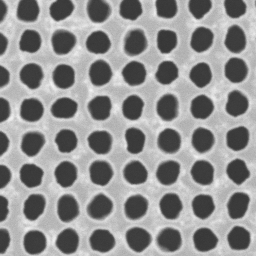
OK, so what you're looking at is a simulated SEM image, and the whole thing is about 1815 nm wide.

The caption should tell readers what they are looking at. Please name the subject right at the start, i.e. a regular array of holes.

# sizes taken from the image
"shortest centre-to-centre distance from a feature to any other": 229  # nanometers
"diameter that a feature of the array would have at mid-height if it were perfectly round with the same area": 0.171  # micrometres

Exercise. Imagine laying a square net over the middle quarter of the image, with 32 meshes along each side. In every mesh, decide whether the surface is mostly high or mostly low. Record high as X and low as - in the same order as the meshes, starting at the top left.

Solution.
--XXXXX-----XXX-----XXXX----XXXX
---XXX------XXX------XX------XXX
---XXX------XX-------XX------XX-
---XXXX-----XXX-----XXX-----XXXX
---XXXX----XXXX-----XXXX---XXXXX
--XXXXXXXXXXXXXXXXXXXXXXXXXXXXXX
XXXXXXXXXXXXXXXXXXXXXXXXXXXXXXXX
XXXXXXXXXXXXXXXXXXXXXXXXXX-XXXXX
-XXXXXX----XXXXX---XXXXX----XXXX
---XXX------XXX-----XXX------XXX
---XXX------XX------XXX------XXX
---XXX------XX------XXX-----XXXX
---XXXX-----XXX----XXXX-----XXXX
--XXXXX----XXXXX---XXXXX----XXXX
XXXXXXXXXXXXXXXXXXXXXXXXXXXXXXXX
XXXXXXXXXXXXXXXXXXXXXXXXXXXXXXXX
--XXXXXXXXXXXXX----XXXXXX---XXXX
---XXXX-----XXX-----XXXX-----XXX
---XXX------XXX-----XXX------XXX
---XXX------XXX-----XXX------XXX
---XXX------XXXX----XXXX-----XXX
--XXXXX----XXXXX----XXXXX----XXX
XXXXXXXX--XXXXXXX-XXXXXXXXXXXXXX
XXXXXXXXXXXXXXXXXXXXXXXXXXXXXXXX
-XXXXXX---XXXXXXX--XXXXXXX--XXXX
---XXX------XXXX----XXXX-----XXX
---XXX------XXX------XX------XXX
---XXX------XXX------XX------XXX
---XXXX-----XXX------XX-----XXXX
---XXXX----XXXXX----XXXX----XXXX
--XXXXXXXXXXXXXXXXXXXXXXXXXXXXXX
XXXXXXXXXXXXXXXXXXXXXXXXXXXXXXXX